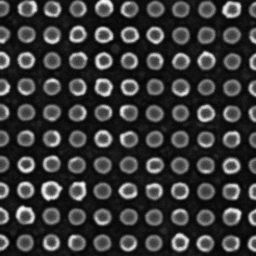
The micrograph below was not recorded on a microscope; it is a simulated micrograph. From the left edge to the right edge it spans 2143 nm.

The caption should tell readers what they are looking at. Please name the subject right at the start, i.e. a regular array of raised bodies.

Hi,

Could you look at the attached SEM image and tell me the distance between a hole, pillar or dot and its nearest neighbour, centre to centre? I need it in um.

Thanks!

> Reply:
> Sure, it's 0.213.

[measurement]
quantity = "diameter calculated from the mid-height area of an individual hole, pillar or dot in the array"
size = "139 nanometres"